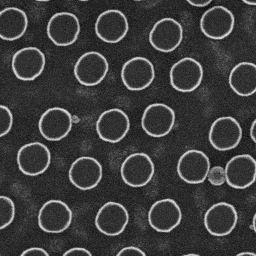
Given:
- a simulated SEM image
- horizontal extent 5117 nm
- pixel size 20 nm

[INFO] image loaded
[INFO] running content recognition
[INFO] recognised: a regular array of raised bodies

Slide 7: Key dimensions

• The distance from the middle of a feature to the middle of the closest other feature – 936 nanometres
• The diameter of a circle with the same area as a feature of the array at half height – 31.5 px